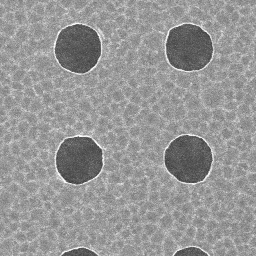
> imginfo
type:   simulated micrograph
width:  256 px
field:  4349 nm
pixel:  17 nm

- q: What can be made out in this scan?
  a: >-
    holes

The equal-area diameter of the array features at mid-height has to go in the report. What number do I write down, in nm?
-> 822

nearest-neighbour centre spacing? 1870 nanometres